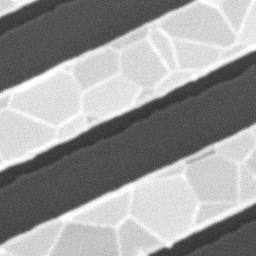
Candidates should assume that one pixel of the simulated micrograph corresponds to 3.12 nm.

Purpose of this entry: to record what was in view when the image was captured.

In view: lines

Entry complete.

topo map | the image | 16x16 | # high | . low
#..........#####
.........#######
.......#########
.....##########.
...##########...
.##########.....
#########.......
#######.........
#####..........#
###.........####
..........######
........########
......##########
....##########..
..##########....
##########......